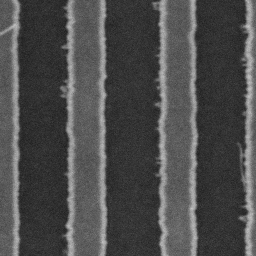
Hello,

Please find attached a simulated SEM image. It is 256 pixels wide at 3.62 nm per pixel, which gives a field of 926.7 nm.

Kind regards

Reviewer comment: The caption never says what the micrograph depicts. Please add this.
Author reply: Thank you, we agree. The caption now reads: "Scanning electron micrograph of lines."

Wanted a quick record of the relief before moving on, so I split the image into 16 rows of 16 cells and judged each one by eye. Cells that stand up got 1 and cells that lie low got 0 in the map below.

1000111000110001
1000111000110001
1000111000110001
1000111000110001
1000111000110001
1000111000110001
1000111000110001
1000111000110001
1000111000110001
1000111000110001
1000111000110001
1000111000110001
1000111000110001
1000111000110001
1000111000110001
1000111000110001